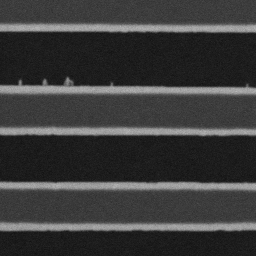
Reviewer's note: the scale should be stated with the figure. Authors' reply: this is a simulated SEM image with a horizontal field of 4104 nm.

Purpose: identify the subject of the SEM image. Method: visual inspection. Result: lines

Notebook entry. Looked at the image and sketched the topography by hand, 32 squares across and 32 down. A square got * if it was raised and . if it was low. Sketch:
********************************
********************************
********************************
********************************
................................
................................
................................
................................
................................
................................
................................
********************************
********************************
********************************
********************************
********************************
********************************
................................
................................
................................
................................
................................
................................
********************************
********************************
********************************
********************************
********************************
................................
................................
................................
................................